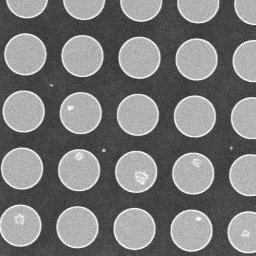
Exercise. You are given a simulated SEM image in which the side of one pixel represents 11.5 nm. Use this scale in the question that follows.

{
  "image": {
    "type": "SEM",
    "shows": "an array of small figures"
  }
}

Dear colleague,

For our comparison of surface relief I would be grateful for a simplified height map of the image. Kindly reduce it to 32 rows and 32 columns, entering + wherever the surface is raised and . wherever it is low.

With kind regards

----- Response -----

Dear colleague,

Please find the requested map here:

.+++++..+++++..+++++..+++++..+++
..+++....++++...++++..+++++...++
.................+.....+++....++
................................
..++......+.....................
.++++...++++....+++....+++....++
.+++++..+++++..+++++..+++++..+++
.+++++..+++++..+++++..+++++..+++
.++++...++++...+++++..+++++..+++
..........+.....+++....+++....++
................................
..++............................
.++++...++++...++++....+++....++
++++++..+++++..+++++..+++++..+++
++++++.++++++..+++++..+++++..+++
.++++...++++...+++++..+++++..+++
.........++.....+++....+++....++
................................
................................
.++++...++++...++++....++.....++
+++++..+++++...++++...++++...+++
+++++..+++++..++++++..+++++..+++
.++++...++++...++++...+++++..+++
..++.....++....++++...++++...+++
................................
................................
.+++....+++....+++.....++.....++
+++++..+++++..+++++...++++...+++
+++++..+++++..+++++..+++++...+++
+++++..+++++..+++++..+++++...+++
.+++....+++....++++...++++...+++
..............................++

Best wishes